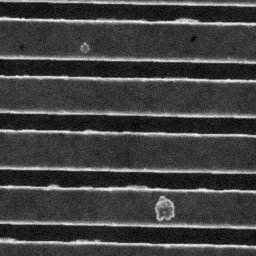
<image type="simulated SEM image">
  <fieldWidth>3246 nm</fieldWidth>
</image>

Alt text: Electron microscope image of lines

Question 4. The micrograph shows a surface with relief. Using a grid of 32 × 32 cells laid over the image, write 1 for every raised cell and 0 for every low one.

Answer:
00000000000000000000111111111111
00000000000000000000000000000000
11111000000000000000000000000000
11111111111111111111111111111111
11111111111111111111111111111111
11111111111111111111111111111111
11111111111111111111111111111111
00000000000000011111111111111111
00000000000000000000000000000000
00000000000000000000000000000000
11111111111111111111111111111111
11111111111111111111111111111111
11111111111111111111111111111111
11111111111111111111111111111111
00000000000000000000000000001111
00000000000000000000000000000000
11111111000000000000000000000000
11111111111111111111111111111111
11111111111111111111111111111111
11111111111111111111111111111111
11111111111111111111111111111111
00000000000000000000000001111111
00000000000000000000000000000000
11111110000000000000000000000000
11111111111111111111111111111111
11111111111111111111111111111111
11111111111111111111111111111111
11111111111111111111111111111111
00000000000000000000000000000000
00000000000000000000000000000000
11111111111111111110000000000000
11111111111111111111111111111111